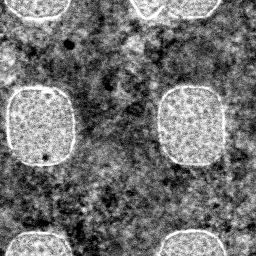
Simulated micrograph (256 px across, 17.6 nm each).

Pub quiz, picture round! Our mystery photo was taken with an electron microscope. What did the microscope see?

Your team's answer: raised bodies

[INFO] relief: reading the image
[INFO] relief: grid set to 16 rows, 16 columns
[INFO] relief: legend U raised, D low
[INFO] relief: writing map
DUUUDDDDUUUUUDDD
DDDDDDDDDDDDDDDD
DDDDDDDDDDDDDDDD
DDDDDDDDDDDDDDDD
DDDDDDDDDDDDDDDD
DDDDDDDDDDDUUDDD
DUUUDDDDDDUUUUDD
DUUUUDDDDDUUUUDD
DUUUUDDDDDUUUUDD
DUUUDDDDDDUUUUDD
DDDDDDDDDDDDDDDD
DDDDDDDDDDDDDDDD
DDDDDDDDDDDDDDDD
DDDDDDDDDDDDDDDD
DDDDDDDDDDDUUDDD
DUUUDDDDDDUUUUDD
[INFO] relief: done